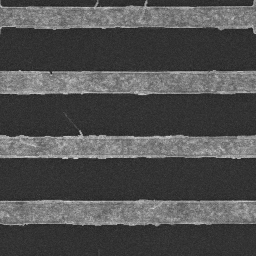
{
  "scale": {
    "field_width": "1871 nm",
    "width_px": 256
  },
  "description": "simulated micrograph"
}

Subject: one or a few lines or trenches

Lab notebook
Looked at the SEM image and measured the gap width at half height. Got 317 nm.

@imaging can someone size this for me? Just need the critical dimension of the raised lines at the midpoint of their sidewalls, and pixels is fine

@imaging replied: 22.1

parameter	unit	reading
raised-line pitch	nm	476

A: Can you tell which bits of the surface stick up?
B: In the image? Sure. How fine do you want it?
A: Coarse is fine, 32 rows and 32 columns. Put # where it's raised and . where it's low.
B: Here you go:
................................
################################
################################
....#####...##.............#####
................................
................................
................................
................................
................................
################################
################################
################################
................................
................................
................................
................................
................................
################################
################################
################################
................................
................................
................................
................................
................................
################################
################################
################################
................................
................................
................................
................................